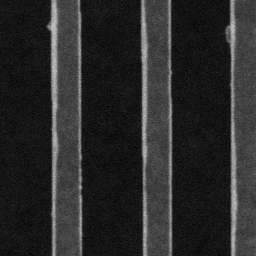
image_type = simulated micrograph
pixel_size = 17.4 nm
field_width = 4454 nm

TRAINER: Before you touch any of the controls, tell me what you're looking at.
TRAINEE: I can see lines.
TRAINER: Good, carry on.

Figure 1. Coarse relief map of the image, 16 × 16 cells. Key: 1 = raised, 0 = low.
0001100001100011
0001100001100011
0001100001100001
0001100001100011
0001100001100011
0001100001100011
0001100001100011
0001100001100011
0001100001100001
0001100001100001
0001100001100001
0001100001100001
0001100001100001
0001100001100001
0001100001100001
0001100001100001